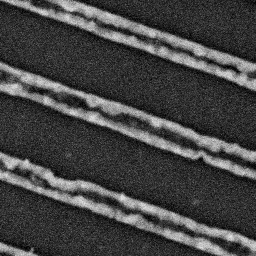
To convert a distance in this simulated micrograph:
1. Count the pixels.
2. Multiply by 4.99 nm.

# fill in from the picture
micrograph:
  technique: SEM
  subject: one or a few lines or trenches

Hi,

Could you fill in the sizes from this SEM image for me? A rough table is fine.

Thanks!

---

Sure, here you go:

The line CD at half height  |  0.1 micrometres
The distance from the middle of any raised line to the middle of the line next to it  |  84.3 px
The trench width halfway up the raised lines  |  64 pixels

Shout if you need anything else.